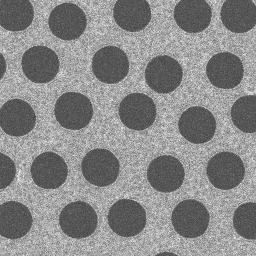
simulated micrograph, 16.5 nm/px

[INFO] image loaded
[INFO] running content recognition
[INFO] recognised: a regular array of holes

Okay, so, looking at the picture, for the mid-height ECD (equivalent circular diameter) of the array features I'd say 632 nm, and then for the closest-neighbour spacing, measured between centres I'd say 844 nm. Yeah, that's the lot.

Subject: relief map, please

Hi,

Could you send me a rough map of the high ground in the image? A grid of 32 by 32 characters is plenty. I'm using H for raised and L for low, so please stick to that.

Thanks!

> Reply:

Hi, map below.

LLLLHHHHLHHHHHLLLLLHHHLLLLHHLLLL
LLLLHHLLLLHHHHLLLLLHHHLLLLHHLLLL
LLLLHHLLLLLHHHLLLLLHHHLLLLHHLLLL
LLLHHHLLLLLHHHHLLLHHHHHLLLHHLLLL
HHHHHHHLLLHHHHHHHHHHHHHHHHHHHHHH
HHHHHHHHHHHHHHHHHHHHHHHHHHHHHHHH
HHHLLLLHHHHHLLLHHHHHHHHHHHHHHHHH
LHHLLLLHHHHHLLLLHHHLLLHHHHLLLLHH
LHHLLLLHHHHLLLLLHHLLLLLHHHLLLLHH
HHHLLLLHHHHHLLLLHHLLLLLHHHLLLLHH
HHHHHHHHHHHHHHHHHHLLLLHHHHHLLLHH
HHHHHHHHLHHHHHHHHHHLLHHHHHHHHHHH
HLLHHHHLLLLHHHHLLLLHHHHHHHHHHHLL
LLLLHHHLLLLLHHHLLLLLHHHHLLHHHLLL
LLLLLHHLLLLLHHHLLLLLHHHLLLLHHLLL
LLLLHHHLLLLHHHHLLLLHHHLLLLLHHLLL
HLLLHHHHHHHHHHHHHHHHHHHLLLLHHHLL
HHHHHHHHHHHHHHHHHHHHHHHLLLHHHHHH
HHHHHHHHHHHHHHHHHHHHHHHHHHHHHHHH
LHHHHLLHHHHLLLHHHHHHLLHHHHHLLLHH
LLHHLLLLHHLLLLLHHHHLLLLHHHLLLLHH
LLHHLLLLHHLLLLLHHHLLLLLHHHLLLLLH
LLHHLLLLHHHLLLHHHHLLLLLHHHLLLLHH
LHHHHLLHHHHHHHHHHHHLLLHHHHHLLHHH
HHHHHHHHHHHHHHHHHHHHHHHHHHHHHHHH
LLLHHHHHHLLHHHLLLHHHHHLLLHHHHHLL
LLLLHHHHLLLLHHLLLLHHHHLLLLHHHLLL
LLLLHHHLLLLLHHLLLLHHHLLLLLHHHLLL
LLLLHHHHLLLLHHLLLLHHHHLLLLHHHLLL
LLLHHHHHHLLHHHHLLHHHHHHLLHHHHHLL
HHHHHHHHHHHHHHHHHHHHHHHHHHHHHHHH
HHHHHHHHHHHHHHHHHHHHLHHHHHHHHHHH